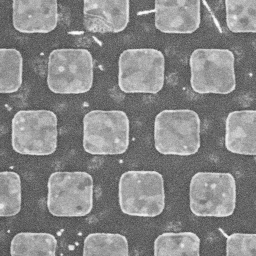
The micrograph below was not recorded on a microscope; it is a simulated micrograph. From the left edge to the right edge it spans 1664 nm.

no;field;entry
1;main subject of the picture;a regular array of raised bodies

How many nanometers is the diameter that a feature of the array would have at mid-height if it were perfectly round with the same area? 310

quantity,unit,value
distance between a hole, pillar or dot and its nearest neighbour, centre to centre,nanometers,461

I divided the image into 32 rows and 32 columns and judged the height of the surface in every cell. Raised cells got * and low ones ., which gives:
..*****....*****...******...****
..*****....*****...******...****
..*****......***...******...****
..*****.......*.....*****....***
................................
................................
**.....****.....****....*****...
***...*****....*****....*****...
***...*****....*****....*****...
**....*****....*****....*****...
**....*****....*****....*****...
**.....****.....****.....****...
................................
................................
..*****....*****....*****....***
..*****...******....*****...****
..*****....*****...******...****
..*****...******...******...****
..*****....*****....*****....***
................................
................................
................................
**....*****....*****....*****...
**....*****....*****....*****...
**....*****....*****....*****...
**....*****....*****....*****...
**....*****.....****....*****...
................................
................................
..****.....****.....****.....***
.******....*****...******...****
.******...******...******...****